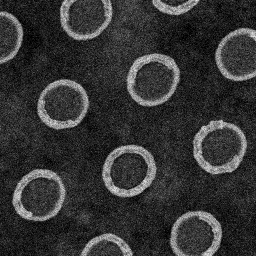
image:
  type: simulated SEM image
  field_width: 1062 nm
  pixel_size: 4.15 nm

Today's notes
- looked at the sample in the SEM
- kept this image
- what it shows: raised bodies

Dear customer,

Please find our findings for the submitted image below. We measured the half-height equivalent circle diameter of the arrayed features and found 201 nanometres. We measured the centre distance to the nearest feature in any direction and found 387 nm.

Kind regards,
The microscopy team